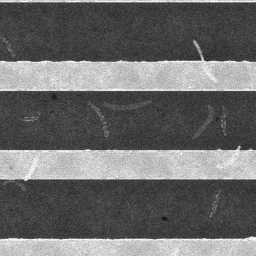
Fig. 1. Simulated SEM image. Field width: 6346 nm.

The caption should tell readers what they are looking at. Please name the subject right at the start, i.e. lines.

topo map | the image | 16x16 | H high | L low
LLLLLLLLLLLLLLLL
LLLLLLLLLLLLLLLL
LLLLLLLLLLLLLLLL
LLLLLLLLLLLLLLLL
HHHHHHHHHHHHHHHH
HHHHHHHHHHHHHHHH
LLLLLLLLLLLLLLLL
LLLLLLLLLLLLLLLL
LLLLLLLLLLLLLLLL
HHHHHHHHHHHHHHHH
HHHHHHHHHHHHHHHH
LLLLLLLLLLLLLLLL
LLLLLLLLLLLLLLLL
LLLLLLLLLLLLLLLL
LLLLLLLLLLLLLLLL
HHHHHHHHHHHHHHHH